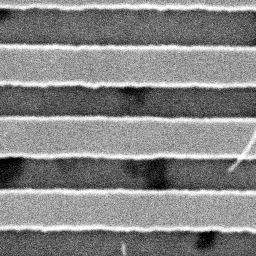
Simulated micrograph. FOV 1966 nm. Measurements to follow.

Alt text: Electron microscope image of lines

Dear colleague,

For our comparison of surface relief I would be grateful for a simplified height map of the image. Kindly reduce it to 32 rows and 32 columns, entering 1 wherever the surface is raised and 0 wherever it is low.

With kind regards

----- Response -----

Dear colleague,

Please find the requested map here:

11111111111111111111111111111111
00000000000000000000000000000000
00000000000000000000000000000000
00000000000000000000000000000000
00000000000000000000000000000000
00000000000000000000000000000000
11111111111111111111111111111111
11111111111111111111111111111111
11111111111111111111111111111111
11111111111111111111111111111111
00111111011111111111111111111111
00000000000000000000000000000000
00000000000000000000000000000000
00000000000000000000000000000000
00000000000000000000000000000000
11111111111111111111111111111111
11111111111111111111111111111111
11111111111111111111111111111111
11111111111111111111111111111111
10011111000111111111011111111111
00000000000000000000000000000000
00000000000000000000000000000000
00000000000000000000000000000000
00000000000000000000000000000000
11111111111111111111111111111111
11111111111111111111111111111111
11111111111111111111111111111111
11111111111111111111111111111111
11111111111111111111111111111111
00000000000000000000000000000000
00000000000000000000000000000000
00000000000000000000000000000000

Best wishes